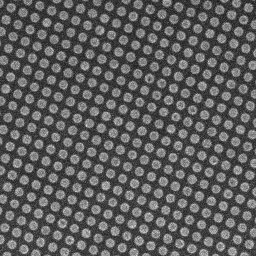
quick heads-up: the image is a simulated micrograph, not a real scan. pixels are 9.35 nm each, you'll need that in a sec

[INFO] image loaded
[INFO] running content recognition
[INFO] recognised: a regular array of raised bodies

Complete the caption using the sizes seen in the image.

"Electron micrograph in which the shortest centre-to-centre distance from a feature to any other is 119 nanometres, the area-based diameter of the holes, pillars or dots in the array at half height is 78.3 nanometres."